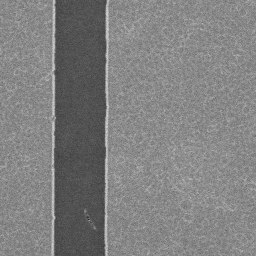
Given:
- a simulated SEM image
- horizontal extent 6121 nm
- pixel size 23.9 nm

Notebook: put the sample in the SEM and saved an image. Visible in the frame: one or a few lines or trenches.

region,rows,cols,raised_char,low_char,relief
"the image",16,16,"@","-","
@@@----@@@@@@@@@
@@@----@@@@@@@@@
@@@----@@@@@@@@@
@@@----@@@@@@@@@
@@@----@@@@@@@@@
@@@----@@@@@@@@@
@@@----@@@@@@@@@
@@@----@@@@@@@@@
@@@----@@@@@@@@@
@@@----@@@@@@@@@
@@@----@@@@@@@@@
@@@----@@@@@@@@@
@@@----@@@@@@@@@
@@@----@@@@@@@@@
@@@----@@@@@@@@@
@@@----@@@@@@@@@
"